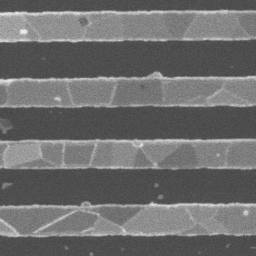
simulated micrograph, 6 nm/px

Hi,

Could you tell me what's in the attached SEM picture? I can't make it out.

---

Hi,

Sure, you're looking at lines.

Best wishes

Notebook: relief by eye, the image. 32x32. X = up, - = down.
--------------------------------
-------------------X-X-----XXXXX
XXXXXXXXXXXXXXXXXXXXXXXXXXXXXXXX
XXXXXXXXXXXXXXXXXXXXXXXXXXXXXXXX
XXXXXXXXXXXXXXXXXXXXXXXXXXXXXXXX
--------------------------------
--------------------------------
--------------------------------
--------------------------------
--------------------------------
XXXXXXXXXXXXXXXXXXXXXXXXXXXXXXXX
XXXXXXXXXXXXXXXXXXXXXXXXXXXXXXXX
XXXXXXXXXXXXXXXXXXXXXXXXXXXXXXXX
--------------------------------
--------------------------------
X-------------------------------
--------------------------------
------------------------------XX
XXXXXXXXXXXXXXXXXXXXXXXXXXXXXXXX
XXXXXXXXXXXXXXXXXXXXXXXXXXXXXXXX
XXXXXXXXXXXXXXXXXXXXXXXXXXXXXXXX
--------------------------------
--------------------------------
--------------------------------
--------------------------------
--------------------------------
XXXXXXXXXXXXXXXXXXXXXXXXXXXXXXXX
XXXXXXXXXXXXXXXXXXXXXXXXXXXXXXXX
XXXXXXXXXXXXXXXXXXXXXXXXXXXXXXXX
-XXXXX--------------------------
--------------------------------
--------------------------------